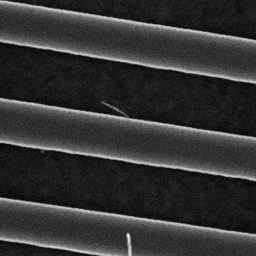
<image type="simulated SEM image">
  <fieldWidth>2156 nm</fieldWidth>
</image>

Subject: lines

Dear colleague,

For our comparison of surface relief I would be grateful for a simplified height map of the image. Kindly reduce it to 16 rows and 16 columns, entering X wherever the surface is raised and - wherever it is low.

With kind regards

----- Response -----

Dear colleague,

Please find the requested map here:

XXX-------------
XXXXXXXXX-------
XXXXXXXXXXXXXXXX
-----XXXXXXXXXXX
------------XXXX
----------------
XXX-------------
XXXXXXXXX-------
XXXXXXXXXXXXXXX-
----XXXXXXXXXXXX
-----------XXXXX
----------------
X---------------
XXXXXXXX--------
XXXXXXXXXXXXXXX-
----XXXXXXXXXXXX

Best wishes